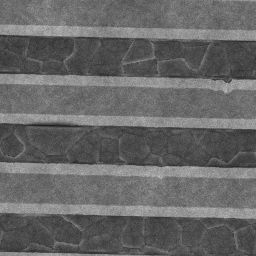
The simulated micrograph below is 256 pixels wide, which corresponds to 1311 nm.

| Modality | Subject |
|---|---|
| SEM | one or a few lines or trenches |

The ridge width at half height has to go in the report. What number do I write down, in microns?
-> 0.203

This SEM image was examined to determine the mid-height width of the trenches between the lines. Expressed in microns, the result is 0.253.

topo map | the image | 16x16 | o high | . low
oooooooooooooooo
oooooooooooooooo
................
................
................
oooooooooooooooo
oooooooooooooooo
...ooooooooooooo
................
................
oo..............
oooooooooooooooo
oooooooooooooooo
................
................
................